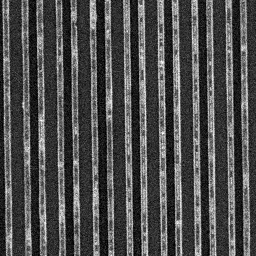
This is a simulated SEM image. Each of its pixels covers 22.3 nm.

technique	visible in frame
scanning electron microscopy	parallel lines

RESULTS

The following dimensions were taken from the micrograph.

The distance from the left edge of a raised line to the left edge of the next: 378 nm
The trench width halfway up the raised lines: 258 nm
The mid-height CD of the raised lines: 5.5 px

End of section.